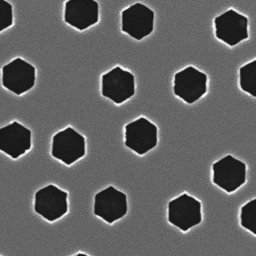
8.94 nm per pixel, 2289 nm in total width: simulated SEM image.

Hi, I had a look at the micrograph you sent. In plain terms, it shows a regular array of holes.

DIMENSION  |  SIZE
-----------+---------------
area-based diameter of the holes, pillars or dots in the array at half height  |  302 nanometers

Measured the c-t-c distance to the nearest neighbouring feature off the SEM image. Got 532 nm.